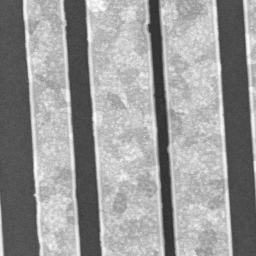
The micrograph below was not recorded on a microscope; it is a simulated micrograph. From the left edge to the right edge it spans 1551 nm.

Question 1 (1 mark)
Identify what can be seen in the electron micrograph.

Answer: one or a few lines or trenches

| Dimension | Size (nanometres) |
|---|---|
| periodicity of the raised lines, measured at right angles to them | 436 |